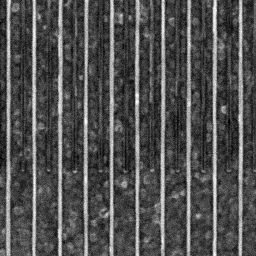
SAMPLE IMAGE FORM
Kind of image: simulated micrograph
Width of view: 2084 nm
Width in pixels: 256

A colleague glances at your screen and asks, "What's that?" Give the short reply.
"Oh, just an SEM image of parallel lines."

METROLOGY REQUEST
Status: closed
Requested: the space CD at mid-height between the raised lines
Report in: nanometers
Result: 88.6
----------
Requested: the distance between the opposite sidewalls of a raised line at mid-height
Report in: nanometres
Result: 20.4